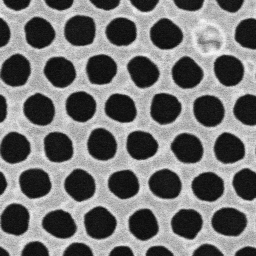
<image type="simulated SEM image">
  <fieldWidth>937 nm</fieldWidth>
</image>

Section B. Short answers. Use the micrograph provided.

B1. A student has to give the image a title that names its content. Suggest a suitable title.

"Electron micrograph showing a regular array of holes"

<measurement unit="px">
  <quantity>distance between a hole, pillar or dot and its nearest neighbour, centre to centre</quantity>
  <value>41.4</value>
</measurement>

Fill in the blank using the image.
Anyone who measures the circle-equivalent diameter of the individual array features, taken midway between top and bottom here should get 114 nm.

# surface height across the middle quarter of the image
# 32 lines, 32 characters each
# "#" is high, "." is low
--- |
...###.......###.......####.....
...##........###........###.....
...###.......###........###.....
...###......#####.......###.....
..#####.....#####......#####....
.#################....#######...
################################
##....#######.#########...######
#......####......#####......####
........##.......#####.......###
........##........####.......###
........##........####.......###
#.......##........####.......###
##.....####.......####......####
##############...######....#####
################################
########...#####################
######......####......#######..#
.#####.......###......######....
..####.......##........####.....
..####.......##.........###.....
..####.......###.......####.....
..####.......###.......#####....
..######....#####....#######....
##############################..
################################
##...##########.########...#####
#.....######......####......####
.......####.......###........###
........###........##........###
........###........##.........##
........###........###.......###